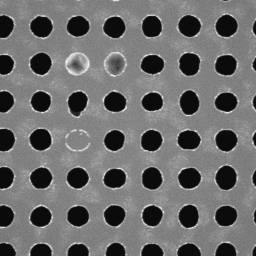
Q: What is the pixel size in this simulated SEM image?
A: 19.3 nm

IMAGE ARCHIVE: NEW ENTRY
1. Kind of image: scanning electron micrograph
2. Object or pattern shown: a regular array of holes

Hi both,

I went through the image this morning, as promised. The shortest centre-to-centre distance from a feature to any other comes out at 711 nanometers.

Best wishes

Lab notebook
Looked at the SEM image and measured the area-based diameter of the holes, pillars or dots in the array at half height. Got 0.414 micrometres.